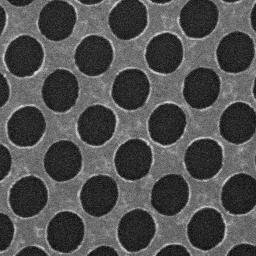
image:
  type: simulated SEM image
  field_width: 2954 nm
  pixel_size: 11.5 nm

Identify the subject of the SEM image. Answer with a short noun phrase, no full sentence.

a regular array of holes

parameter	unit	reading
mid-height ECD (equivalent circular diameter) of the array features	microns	0.473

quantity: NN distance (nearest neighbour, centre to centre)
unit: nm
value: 568